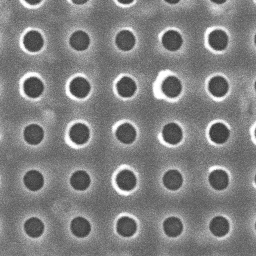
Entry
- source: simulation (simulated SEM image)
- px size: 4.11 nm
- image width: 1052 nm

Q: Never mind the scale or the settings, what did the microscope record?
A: a regular array of holes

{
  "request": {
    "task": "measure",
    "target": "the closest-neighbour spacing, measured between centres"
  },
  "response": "189 nm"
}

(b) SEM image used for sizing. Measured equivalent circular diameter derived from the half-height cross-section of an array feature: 89.2 nanometres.